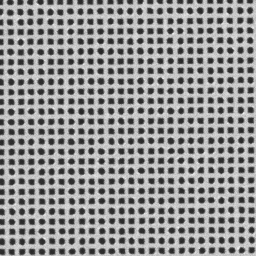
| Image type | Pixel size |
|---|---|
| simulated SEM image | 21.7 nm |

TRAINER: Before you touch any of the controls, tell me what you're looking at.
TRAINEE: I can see a regular array of holes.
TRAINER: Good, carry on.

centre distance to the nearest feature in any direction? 206 nanometers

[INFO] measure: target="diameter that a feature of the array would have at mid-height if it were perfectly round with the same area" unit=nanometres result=151